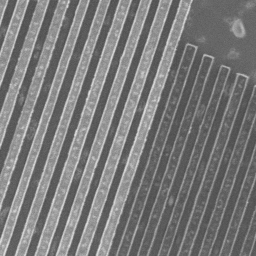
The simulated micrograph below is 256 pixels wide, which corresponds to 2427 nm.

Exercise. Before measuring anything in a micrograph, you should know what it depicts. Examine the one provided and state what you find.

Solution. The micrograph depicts parallel lines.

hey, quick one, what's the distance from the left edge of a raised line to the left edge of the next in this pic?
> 184 nm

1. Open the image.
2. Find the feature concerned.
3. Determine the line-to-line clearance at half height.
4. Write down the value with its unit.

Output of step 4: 92.2 nm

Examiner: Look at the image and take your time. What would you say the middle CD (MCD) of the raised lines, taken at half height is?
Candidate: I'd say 92.2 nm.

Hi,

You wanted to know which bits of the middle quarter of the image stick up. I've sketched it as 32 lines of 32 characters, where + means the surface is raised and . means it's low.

+...++...++...++...++...+++..+++
...+++..+++...++..+++...++...++.
...++...+++..+++..+++..+++..+++.
...++...++...++...++...+++..+++.
..+++..+++..+++..+++...++...++..
..++...+++..+++..+++..+++..+++..
..++...++...++...++...+++..+++..
.+++..+++..+++..+++..+++...++...
.++...+++..+++..+++..+++..+++...
.++...++...++...++...+++..+++..+
+++..+++...++..+++...++...++...+
++...+++..+++..+++..+++..+++..++
++...++...++...++...+++..+++..++
++..+++..+++..+++...++...++...++
+...+++..+++..+++..+++..+++..+++
+...++...++...++...+++..+++..+++
+..+++..+++..+++...++...++...+++
...+++..+++..+++..+++..+++...++.
...++...++...++...+++..+++..+++.
..+++...++..+++...++...++...++..
..+++..+++..+++..+++..+++...++..
..++...++...++...+++..+++..+++..
.+++...++..+++...++...++...++...
.+++..+++..+++..+++..+++..+++...
.++...++...++...+++..+++..+++..+
+++...++..+++...++...++...+++..+
+++..+++..+++..+++..+++...++...+
++...++...++...+++..+++..+++..++
++..+++..+++...++...++...++...++
++..+++..+++..+++..+++..+++...++
+...++...++...+++..+++..+++..+++
+..+++..+++..+++...++...++...++.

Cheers